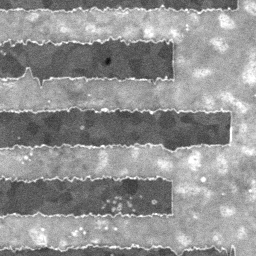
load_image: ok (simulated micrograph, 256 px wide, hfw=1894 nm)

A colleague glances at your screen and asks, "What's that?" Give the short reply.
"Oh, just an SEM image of one or a few lines or trenches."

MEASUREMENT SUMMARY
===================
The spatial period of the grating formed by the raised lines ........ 506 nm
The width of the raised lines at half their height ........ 269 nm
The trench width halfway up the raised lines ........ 236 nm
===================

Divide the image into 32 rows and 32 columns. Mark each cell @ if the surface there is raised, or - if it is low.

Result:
@@@@@@@@@@@@@@@@@@@@@@@@@@@@@@--
--------@-----------------------
--------------------------------
--------------------------------
--------------------------------
@@@@@@@@@@@@@@@@@@@@@@----------
@@@@@@@@@@@@@@@@@@@@@@----------
@@@@@@@@@@@@@@@@@@@@@@----------
@@@@@@@@@@@@@@@@@@@@@@----------
@@@-@@@@@@@@@@@@@@@@@@----------
--------------------------------
--------------------------------
--------------------------------
---------@----------------------
@@@@@@@@@@@@@@@@@@@@@@@@@@@@@---
@@@@@@@@@@@@@@@@@@@@@@@@@@@@@---
@@@@@@@@@@@@@@@@@@@@@@@@@@@@@---
@@@@@@@@@@@@@@@@@@@@@@@@@@@@@---
@@-------------------@@---------
--------------------------------
--------------------------------
--------------------------------
@@--@@@@@@@@@@@@@@@@@-----------
@@@@@@@@@@@@@@@@@@@@@@----------
@@@@@@@@@@@@@@@@@@@@@@----------
@@@@@@@@@@@@@@@@@@@@@@----------
@@@@@@@@@@@@@@@@@@@@@@----------
--------------------------------
--------------------------------
--------------------------------
--------------------------------
@@@@@@@@@@@@@@@@@@@@@@-@@@@@@---